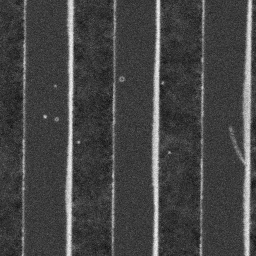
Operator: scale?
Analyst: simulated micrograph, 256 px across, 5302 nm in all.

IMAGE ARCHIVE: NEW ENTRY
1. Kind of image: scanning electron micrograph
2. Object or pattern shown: lines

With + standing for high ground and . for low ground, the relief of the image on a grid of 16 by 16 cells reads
..++...+++...+++
..++...+++...+++
..++...+++...+++
..++...+++...+++
..++...+++...+++
..++...+++...++.
..++...+++...++.
..++...+++...++.
.+++...+++...++.
.+++...+++...++.
.+++...+++...++.
.+++...+++...++.
.+++...+++...++.
.+++...+++...++.
.+++...+++...++.
.+++...+++...++.